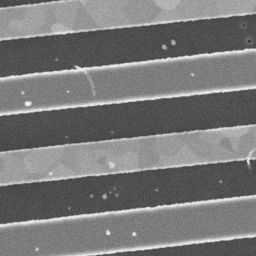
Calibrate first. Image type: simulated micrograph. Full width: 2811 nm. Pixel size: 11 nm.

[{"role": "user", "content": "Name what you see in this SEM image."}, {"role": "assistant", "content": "lines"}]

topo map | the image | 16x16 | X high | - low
XXXXXXXXXXXXXXXX
XXXXXXXXXX------
----------------
------------XXXX
---XXXXXXXXXXXXX
XXXXXXXXXXXXXXXX
XXXXXXX---------
----------------
---------XXXXXXX
XXXXXXXXXXXXXXXX
XXXXXXXXXX------
X---------------
-------------XXX
-----XXXXXXXXXXX
XXXXXXXXXXXXXXXX
XXXXXXXXXX------